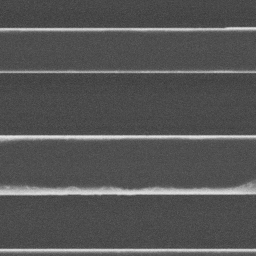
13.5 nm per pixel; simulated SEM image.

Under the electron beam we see lines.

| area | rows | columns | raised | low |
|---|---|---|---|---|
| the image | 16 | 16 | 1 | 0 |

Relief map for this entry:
0000000000000000
0000000000000000
1111111111111111
1111111111111111
1111111111111111
0000000000000000
0000000000000000
0000000000000000
0000000000000000
1111111111111111
1111111111111111
1111111111111111
0000000000000000
0000000000000000
0000000000000000
0000000000000000